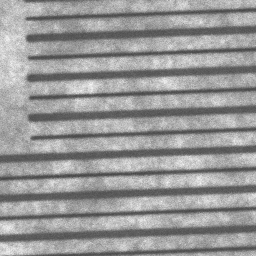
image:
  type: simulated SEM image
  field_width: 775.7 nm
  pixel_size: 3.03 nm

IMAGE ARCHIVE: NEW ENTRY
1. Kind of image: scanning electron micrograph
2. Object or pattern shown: parallel lines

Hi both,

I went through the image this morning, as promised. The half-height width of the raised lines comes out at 43.2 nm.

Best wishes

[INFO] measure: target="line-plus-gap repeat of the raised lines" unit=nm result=60.4